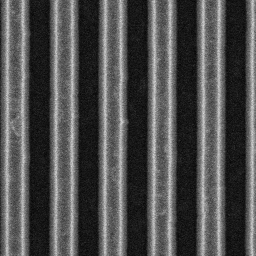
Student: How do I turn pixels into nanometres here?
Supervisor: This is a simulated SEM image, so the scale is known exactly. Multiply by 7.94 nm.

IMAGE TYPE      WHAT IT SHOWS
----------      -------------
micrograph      parallel lines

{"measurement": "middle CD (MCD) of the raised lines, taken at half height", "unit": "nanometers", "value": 171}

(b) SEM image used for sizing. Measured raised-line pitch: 389 nanometres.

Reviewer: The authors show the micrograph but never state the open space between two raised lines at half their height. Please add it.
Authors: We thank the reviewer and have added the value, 214 nanometers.